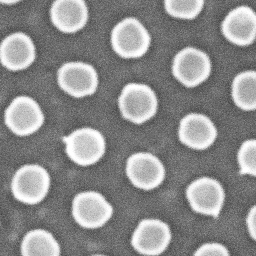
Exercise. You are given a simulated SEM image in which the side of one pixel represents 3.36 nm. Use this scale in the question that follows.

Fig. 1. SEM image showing a regular array of raised bodies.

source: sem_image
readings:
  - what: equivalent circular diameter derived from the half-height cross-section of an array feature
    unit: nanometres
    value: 119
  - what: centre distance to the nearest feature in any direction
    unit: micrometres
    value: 0.218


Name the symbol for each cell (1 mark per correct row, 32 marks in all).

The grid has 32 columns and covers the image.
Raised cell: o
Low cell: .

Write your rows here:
.......ooo...........oooo.......
......ooooo..........oooo....ooo
.......oooo.....o...........oooo
........oo....oooo..........oooo
.oo...........oooo..........oooo
oooo..........oooo..............
oooo...........ooo.....oo.......
oooo..................oooo......
.oo.....ooo...........oooo......
.......ooooo..........oooo....oo
.......ooooo...........oo....ooo
.........ooo...oooo..........ooo
..oo...........oooo..........ooo
.oooo..........oooo............o
.oooo...........ooo.....o.......
.oooo..................ooo......
..oo......oo..........ooooo.....
.........oooo..........oooo.....
.........oooo.................oo
.........ooo.....oo...........oo
................oooo..........oo
..oooo..........oooo...........o
..oooo..........oooo.....o......
..oooo............o.....oooo....
..ooo.....oo...........ooooo....
.........oooo...........oooo....
.........ooooo...........oo....o
..........ooo..................o
.................oooo..........o
...ooo...........oooo...........
...oooo..........oooo...........
...oooo...........oo.....ooo....